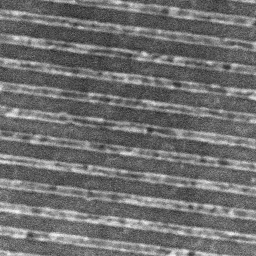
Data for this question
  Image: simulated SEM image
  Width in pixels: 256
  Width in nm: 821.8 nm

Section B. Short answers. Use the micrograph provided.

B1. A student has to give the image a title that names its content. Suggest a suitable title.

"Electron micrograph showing parallel lines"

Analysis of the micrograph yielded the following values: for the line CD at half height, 24.2 nm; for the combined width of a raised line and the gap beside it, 76.6 nm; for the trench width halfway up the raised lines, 0.0521 µm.